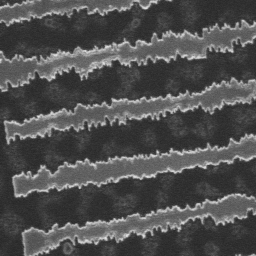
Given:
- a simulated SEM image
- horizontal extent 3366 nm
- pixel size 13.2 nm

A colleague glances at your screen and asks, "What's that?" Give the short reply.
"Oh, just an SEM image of parallel lines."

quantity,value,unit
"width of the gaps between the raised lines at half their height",38.1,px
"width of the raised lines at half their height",17.7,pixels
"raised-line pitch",746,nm